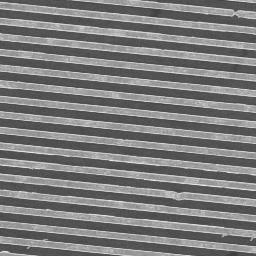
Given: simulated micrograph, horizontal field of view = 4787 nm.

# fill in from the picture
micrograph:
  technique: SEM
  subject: parallel lines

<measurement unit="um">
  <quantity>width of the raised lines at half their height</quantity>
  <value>0.119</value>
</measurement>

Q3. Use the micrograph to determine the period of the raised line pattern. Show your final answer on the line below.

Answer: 0.291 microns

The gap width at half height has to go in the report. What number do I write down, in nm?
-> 172